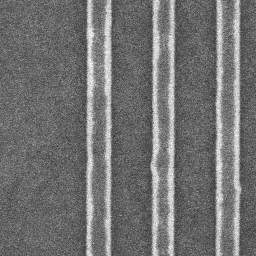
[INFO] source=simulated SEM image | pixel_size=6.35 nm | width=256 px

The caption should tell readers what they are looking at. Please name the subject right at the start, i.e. one or a few lines or trenches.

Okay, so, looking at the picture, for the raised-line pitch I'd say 409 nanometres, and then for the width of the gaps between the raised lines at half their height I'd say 296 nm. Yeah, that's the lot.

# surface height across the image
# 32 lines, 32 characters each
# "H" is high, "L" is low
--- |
LLLLLLLLLLLHHHLLLLLHHLLLLLLHHHLL
LLLLLLLLLLLHHHLLLLLHHLLLLLLHHHLL
LLLLLLLLLLLHHHLLLLLHHLLLLLLHHHLL
LLLLLLLLLLLHHHLLLLLHHLLLLLLHHHLL
LLLLLLLLLLLHHHLLLLLHHLLLLLLHHHLL
LLLLLLLLLLLHHHLLLLLHHLLLLLLHHHLL
LLLLLLLLLLLHHHLLLLLHHLLLLLLHHHLL
LLLLLLLLLLLHHHLLLLLHHLLLLLLHHHLL
LLLLLLLLLLLHHHLLLLLHHLLLLLLHHHLL
LLLLLLLLLLLHHHLLLLLHHLLLLLLHHHLL
LLLLLLLLLLLHHHLLLLLHHLLLLLLHHHLL
LLLLLLLLLLLHHHLLLLLHHLLLLLLHHHLL
LLLLLLLLLLLHHHLLLLLHHLLLLLLHHHLL
LLLLLLLLLLLHHHLLLLLHHLLLLLLHHHLL
LLLLLLLLLLLHHHLLLLLHHLLLLLLHHHLL
LLLLLLLLLLLHHHLLLLLHHLLLLLLHHHLL
LLLLLLLLLLLHHHLLLLLHHLLLLLLHHHLL
LLLLLLLLLLLHHHLLLLLHHLLLLLLHHHLL
LLLLLLLLLLLHHHLLLLLHHLLLLLLHHHLL
LLLLLLLLLLLHHHLLLLLHHLLLLLLHHHLL
LLLLLLLLLLLHHHLLLLLHHLLLLLLHHHLL
LLLLLLLLLLLHHHLLLLLHHLLLLLLHHHLL
LLLLLLLLLLLHHHLLLLLHHLLLLLLHHHLL
LLLLLLLLLLLHHHLLLLLHHLLLLLLHHHLL
LLLLLLLLLLLHHLLLLLLHHLLLLLLHHHLL
LLLLLLLLLLLHHHLLLLLHHLLLLLLHHHLL
LLLLLLLLLLLHHHLLLLLHHLLLLLLHHHLL
LLLLLLLLLLLHHHLLLLLHHLLLLLLHHHLL
LLLLLLLLLLLHHLLLLLLHHLLLLLLHHHLL
LLLLLLLLLLLHHHLLLLLHHLLLLLLHHHLL
LLLLLLLLLLLHHHLLLLLHHLLLLLLHHHLL
LLLLLLLLLLLHHHLLLLLHHLLLLLLHHHLL